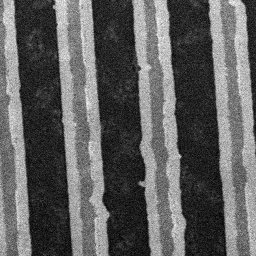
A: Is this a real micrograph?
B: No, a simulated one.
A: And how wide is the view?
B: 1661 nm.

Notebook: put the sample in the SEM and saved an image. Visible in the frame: one or a few lines or trenches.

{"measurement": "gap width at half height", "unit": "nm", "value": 333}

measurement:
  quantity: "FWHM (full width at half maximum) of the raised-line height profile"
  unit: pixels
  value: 24.8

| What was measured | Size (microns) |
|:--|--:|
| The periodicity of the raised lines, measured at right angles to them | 0.498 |